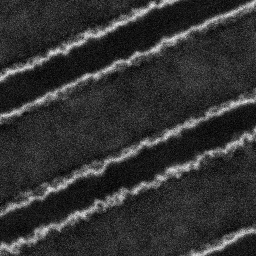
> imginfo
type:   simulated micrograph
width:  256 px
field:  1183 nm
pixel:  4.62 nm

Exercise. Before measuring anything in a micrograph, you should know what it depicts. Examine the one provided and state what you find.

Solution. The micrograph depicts one or a few lines or trenches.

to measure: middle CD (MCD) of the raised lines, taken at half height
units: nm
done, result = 164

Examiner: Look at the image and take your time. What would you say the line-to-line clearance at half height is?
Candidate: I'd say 0.399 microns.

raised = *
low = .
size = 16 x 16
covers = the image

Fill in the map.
.........******.
.......******...
.....******.....
...******.......
.*****..........
****............
**.............*
............****
..........******
........*****...
......*****.....
....*****.......
..*****.........
*****...........
***.............
..............**